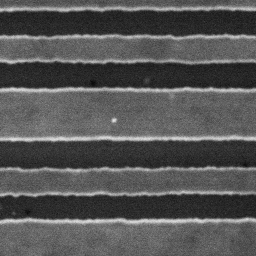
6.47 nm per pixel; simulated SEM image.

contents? lines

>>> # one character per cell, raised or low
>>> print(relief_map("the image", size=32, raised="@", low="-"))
@@@@@@@@@@@@@@@@@@@@@@@@@@@@@@@@
--------------------------------
--------------------------------
--------------------------------
---------@@@-@@--@@-----@@-@@-@-
@@@@@@@@@@@@@@@@@@@@@@@@@@@@@@@@
@@@@@@@@@@@@@@@@@@@@@@@@@@@@@@@@
@@@@@@@@@@@@@@@@@@@@@@@@@@@@@@@@
--------------------------------
--------------------------------
--------------------------------
@@@@@@@@@@@@@@@@@@@@@@@@@@@@@@@@
@@@@@@@@@@@@@@@@@@@@@@@@@@@@@@@@
@@@@@@@@@@@@@@@@@@@@@@@@@@@@@@@@
@@@@@@@@@@@@@@@@@@@@@@@@@@@@@@@@
@@@@@@@@@@@@@@@@@@@@@@@@@@@@@@@@
@@@@@@@@@@@@@@@@@@@@@@@@@@@@@@@@
@@@@@@@@@@@@--@@@@@-@-@@@--@--@@
--------------------------------
--------------------------------
--------------------------------
@@@@@@@@@@@@@@@@@@@@@@@@@@@@@@@@
@@@@@@@@@@@@@@@@@@@@@@@@@@@@@@@@
@@@@@@@@@@@@@@@@@@@@@@@@@@@@@@@@
----@---------------------------
--------------------------------
--------------------------------
-@@@@@--@@-@-@@@-@@@@-@@@@@@@@@@
@@@@@@@@@@@@@@@@@@@@@@@@@@@@@@@@
@@@@@@@@@@@@@@@@@@@@@@@@@@@@@@@@
@@@@@@@@@@@@@@@@@@@@@@@@@@@@@@@@
@@@@@@@@@@@@@@@@@@@@@@@@@@@@@@@@